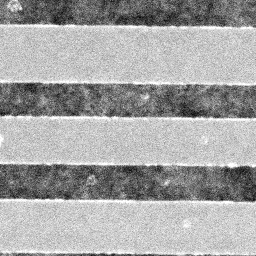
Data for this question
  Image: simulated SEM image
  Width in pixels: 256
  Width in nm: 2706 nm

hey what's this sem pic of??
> lines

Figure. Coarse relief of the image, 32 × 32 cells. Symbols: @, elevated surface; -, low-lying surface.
--------------------------------
--------------------------------
--------------------------------
@@@@@@@@@@@@@@@@@@@@@@@@@@@@@-@@
@@@@@@@@@@@@@@@@@@@@@@@@@@@@@@@@
@@@@@@@@@@@@@@@@@@@@@@@@@@@@@@@@
@@@@@@@@@@@@@@@@@@@@@@@@@@@@@@@@
@@@@@@@@@@@@@@@@@@@@@@@@@@@@@@@@
@@@@@@@@@@@@@@@@@@@@@@@@@@@@@@@@
@@@@@@@@@@@@@@@@@@@@@@@@@@@@@@@@
----------------------------@@@@
--------------------------------
--------------------------------
--------------------------------
--------------------------------
@@@@@@@@@@@@@@@@@@@@@@@@@@@@@@@@
@@@@@@@@@@@@@@@@@@@@@@@@@@@@@@@@
@@@@@@@@@@@@@@@@@@@@@@@@@@@@@@@@
@@@@@@@@@@@@@@@@@@@@@@@@@@@@@@@@
@@@@@@@@@@@@@@@@@@@@@@@@@@@@@@@@
-----@@-@@@@@@@@@@@@@@@@@@@@@@@@
--------------------------------
--------------------------------
--------------------------------
--------------------------------
@@@@@@@@@@@@@@@@@@@@@@@@@@@@@@@@
@@@@@@@@@@@@@@@@@@@@@@@@@@@@@@@@
@@@@@@@@@@@@@@@@@@@@@@@@@@@@@@@@
@@@@@@@@@@@@@@@@@@@@@@@@@@@@@@@@
@@@@@@@@@@@@@@@@@@@@@@@@@@@@@@@@
@@@@@@@@@@@@@@@@@@@@@@@@@@@@@@@@
@@@@@@@@@@@@@@@@@@@@@@@@@@@@@@@@